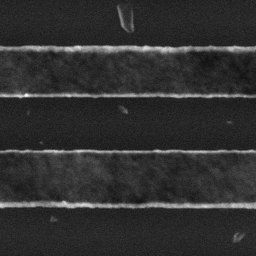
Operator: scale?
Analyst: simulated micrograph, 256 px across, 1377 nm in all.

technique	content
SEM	lines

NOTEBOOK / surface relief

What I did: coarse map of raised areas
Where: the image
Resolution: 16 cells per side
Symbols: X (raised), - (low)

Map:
----------------
----------------
----------------
XXXXXXXXXXXXXXXX
XXXXXXXXXXXXXXXX
XXXXXXXXXXXXXXXX
----------------
----------------
----------------
XXXXXXXXXXXXXXXX
XXXXXXXXXXXXXXXX
XXXXXXXXXXXXXXXX
XXXXXXXXXXXXXXXX
----------------
----------------
----------------